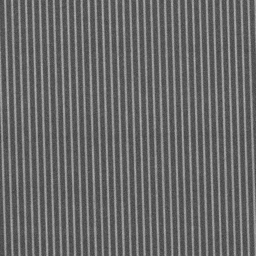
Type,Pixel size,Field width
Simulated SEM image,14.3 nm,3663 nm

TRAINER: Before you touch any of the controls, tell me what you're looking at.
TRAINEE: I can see parallel lines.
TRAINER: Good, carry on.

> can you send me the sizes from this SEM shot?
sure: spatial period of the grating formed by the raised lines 99.5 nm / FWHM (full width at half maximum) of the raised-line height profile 1.5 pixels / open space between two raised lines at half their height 80.5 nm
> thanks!